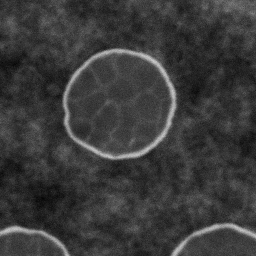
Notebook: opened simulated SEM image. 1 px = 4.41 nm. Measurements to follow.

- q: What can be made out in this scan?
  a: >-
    raised bodies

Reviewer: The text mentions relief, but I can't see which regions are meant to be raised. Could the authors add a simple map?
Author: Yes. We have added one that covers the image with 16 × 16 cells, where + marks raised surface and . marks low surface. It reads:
................
................
................
......+++.......
.....+++++......
....+++++++.....
....+++++++.....
....+++++++.....
.....+++++......
......+++.......
................
................
................
................
+++.........++++
++++.......+++++